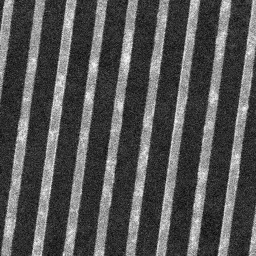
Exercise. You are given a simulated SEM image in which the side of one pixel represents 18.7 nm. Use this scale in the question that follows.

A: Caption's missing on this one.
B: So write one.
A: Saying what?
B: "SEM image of parallel lines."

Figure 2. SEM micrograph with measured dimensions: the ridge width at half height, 0.162 micrometres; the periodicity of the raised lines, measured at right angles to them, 574 nanometers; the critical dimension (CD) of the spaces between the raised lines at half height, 419 nanometres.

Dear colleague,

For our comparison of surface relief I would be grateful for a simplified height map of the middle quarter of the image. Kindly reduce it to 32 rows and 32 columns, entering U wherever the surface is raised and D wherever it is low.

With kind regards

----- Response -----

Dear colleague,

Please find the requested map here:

UDDDDDUUDDDDDDUUDDDDDDUUDDDDDDUU
UDDDDDUUDDDDDDUUDDDDDDUUDDDDDUUD
DDDDDDUUDDDDDDUUDDDDDDUUDDDDDUUD
DDDDDDUUDDDDDDUUDDDDDDUUDDDDDUUD
DDDDDDUUDDDDDDUUDDDDDUUDDDDDDUUD
DDDDDDUUDDDDDUUDDDDDDUUDDDDDDUUD
DDDDDDUUDDDDDUUDDDDDDUUDDDDDDUUD
DDDDDUUDDDDDDUUDDDDDDUUDDDDDDUUD
DDDDDUUDDDDDDUUDDDDDDUUDDDDDDUUD
DDDDDUUDDDDDDUUDDDDDDUUDDDDDUUDD
DDDDDUUDDDDDDUUDDDDDDUUDDDDDUUDD
DDDDDUUDDDDDUUUDDDDDUUDDDDDDUUDD
DDDDDUUDDDDDUUDDDDDDUUDDDDDDUUDD
DDDDDUUDDDDDUUDDDDDDUUDDDDDDUUDD
DDDDDUUDDDDDUUDDDDDDUUDDDDDDUUDD
DDDDUUDDDDDDUUDDDDDDUUDDDDDDUUDD
DDDDUUDDDDDDUUDDDDDDUUDDDDDUUDDD
DDDDUUDDDDDDUUDDDDDDUUDDDDDUUDDD
DDDDUUDDDDDDUUDDDDDUUUDDDDDUUDDD
DDDDUUDDDDDUUUDDDDDUUDDDDDDUUDDD
DDDDUUDDDDDUUDDDDDDUUDDDDDDUUDDD
DDDDUUDDDDDUUDDDDDDUUDDDDDDUUDDD
DDDUUDDDDDDUUDDDDDDUUDDDDDDUUDDD
DDDUUDDDDDDUUDDDDDDUUDDDDDUUDDDD
DDDUUDDDDDDUUDDDDDDUUDDDDDUUDDDD
DDDUUDDDDDDUUDDDDDDUUDDDDDUUDDDD
DDDUUDDDDDUUUDDDDDUUDDDDDDUUDDDD
DDDUUDDDDDUUDDDDDDUUDDDDDDUUDDDD
DDDUUDDDDDUUDDDDDDUUDDDDDDUUDDDD
DDUUUDDDDDUUDDDDDDUUDDDDDDUUDDDD
DDUUDDDDDDUUDDDDDDUUDDDDDUUUDDDD
DDUUDDDDDDUUDDDDDDUUDDDDDUUDDDDD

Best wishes